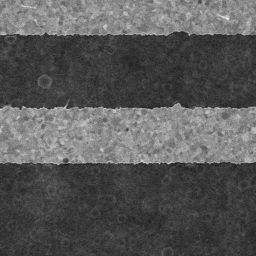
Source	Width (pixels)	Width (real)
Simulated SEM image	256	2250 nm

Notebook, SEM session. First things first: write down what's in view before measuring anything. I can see one or a few lines or trenches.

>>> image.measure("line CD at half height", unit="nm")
481